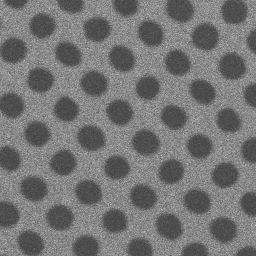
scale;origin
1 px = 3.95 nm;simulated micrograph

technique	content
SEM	a regular array of holes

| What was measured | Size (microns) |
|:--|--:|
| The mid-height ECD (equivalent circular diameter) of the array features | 0.102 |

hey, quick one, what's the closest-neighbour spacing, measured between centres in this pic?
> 150 nanometers